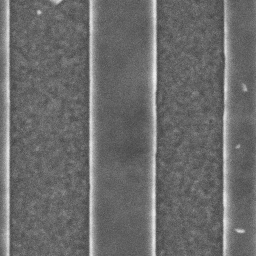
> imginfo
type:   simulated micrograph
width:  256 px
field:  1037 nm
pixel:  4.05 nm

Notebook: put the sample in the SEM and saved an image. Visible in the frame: lines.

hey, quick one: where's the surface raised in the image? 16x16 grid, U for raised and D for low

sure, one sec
UDDDDDUUUUDDDDUU
UDDDDDUUUUDDDDUU
UDDDDDUUUUDDDDUU
UDDDDDUUUUDDDDUU
UDDDDDUUUUDDDDUU
UDDDDDUUUUDDDDUU
UDDDDDUUUUDDDDUU
UDDDDDUUUUDDDDUU
UDDDDDUUUUDDDDUU
UDDDDDUUUUDDDDUU
UDDDDDUUUUDDDDUU
UDDDDDUUUUDDDDUU
UDDDDDUUUUDDDDUU
UDDDDDUUUUDDDDUU
UDDDDDUUUUDDDDUU
UDDDDDUUUUDDDDUU